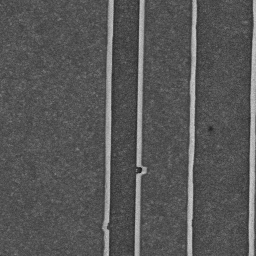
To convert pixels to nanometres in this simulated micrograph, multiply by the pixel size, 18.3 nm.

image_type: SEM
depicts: one or a few lines or trenches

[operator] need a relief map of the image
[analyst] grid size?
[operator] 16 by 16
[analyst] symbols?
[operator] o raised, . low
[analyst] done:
ooooooo..ooo....
ooooooo..ooo....
ooooooo..ooo....
ooooooo..ooo....
ooooooo..ooo....
ooooooo..ooo....
ooooooo..ooo....
ooooooo..ooo....
ooooooo..ooo....
ooooooo..ooo....
ooooooo..ooo....
ooooooo..ooo....
ooooooo..ooo....
ooooooo..ooo....
ooooooo..ooo....
ooooooo..ooo....